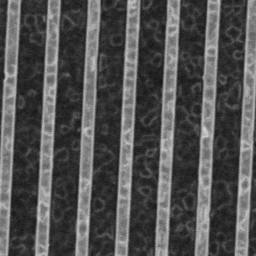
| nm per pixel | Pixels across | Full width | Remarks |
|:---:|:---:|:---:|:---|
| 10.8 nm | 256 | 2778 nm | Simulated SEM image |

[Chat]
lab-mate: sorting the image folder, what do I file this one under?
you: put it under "parallel lines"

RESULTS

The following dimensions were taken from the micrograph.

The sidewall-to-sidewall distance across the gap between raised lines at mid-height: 310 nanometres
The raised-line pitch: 0.432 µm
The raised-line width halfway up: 126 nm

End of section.